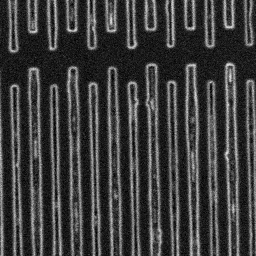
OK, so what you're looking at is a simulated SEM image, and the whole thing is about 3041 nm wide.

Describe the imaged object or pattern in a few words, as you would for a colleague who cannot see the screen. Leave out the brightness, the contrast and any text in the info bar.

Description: parallel lines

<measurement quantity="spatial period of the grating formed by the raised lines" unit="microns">0.234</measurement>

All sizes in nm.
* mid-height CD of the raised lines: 163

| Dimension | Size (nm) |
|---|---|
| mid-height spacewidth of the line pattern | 60.8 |